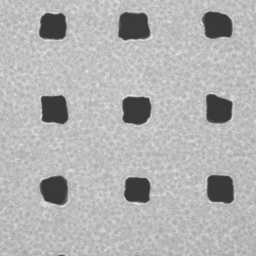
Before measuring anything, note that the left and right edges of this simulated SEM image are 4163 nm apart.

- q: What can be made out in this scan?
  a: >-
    a regular array of holes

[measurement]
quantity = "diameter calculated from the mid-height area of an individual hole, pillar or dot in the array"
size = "476 nm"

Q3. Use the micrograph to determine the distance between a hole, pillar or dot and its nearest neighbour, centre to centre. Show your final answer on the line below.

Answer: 80.4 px